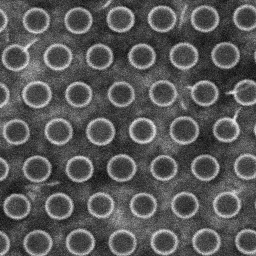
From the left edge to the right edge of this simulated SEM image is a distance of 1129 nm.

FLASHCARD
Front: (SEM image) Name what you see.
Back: a regular array of raised bodies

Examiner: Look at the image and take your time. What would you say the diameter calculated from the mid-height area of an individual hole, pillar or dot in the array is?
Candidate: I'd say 114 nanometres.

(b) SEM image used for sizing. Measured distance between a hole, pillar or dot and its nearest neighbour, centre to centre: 184 nanometres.